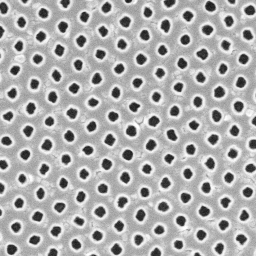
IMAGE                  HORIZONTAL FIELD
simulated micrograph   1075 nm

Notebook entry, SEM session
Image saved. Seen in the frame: a regular array of holes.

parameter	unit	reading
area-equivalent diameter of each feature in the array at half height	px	10.9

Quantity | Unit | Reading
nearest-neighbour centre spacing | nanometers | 96.3